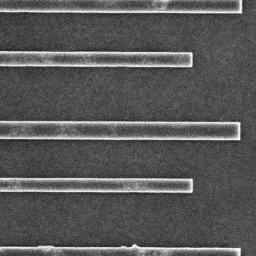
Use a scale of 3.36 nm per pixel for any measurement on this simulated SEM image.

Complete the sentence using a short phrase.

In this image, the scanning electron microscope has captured one or a few lines or trenches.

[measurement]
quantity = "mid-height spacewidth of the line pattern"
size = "160 nm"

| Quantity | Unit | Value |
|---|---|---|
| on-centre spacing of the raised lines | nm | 211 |